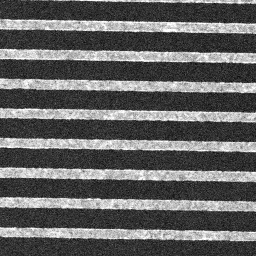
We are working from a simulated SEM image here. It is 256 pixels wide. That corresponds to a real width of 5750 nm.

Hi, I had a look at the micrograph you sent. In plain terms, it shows parallel lines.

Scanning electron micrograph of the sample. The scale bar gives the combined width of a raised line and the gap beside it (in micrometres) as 0.667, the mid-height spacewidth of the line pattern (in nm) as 472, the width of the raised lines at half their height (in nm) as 194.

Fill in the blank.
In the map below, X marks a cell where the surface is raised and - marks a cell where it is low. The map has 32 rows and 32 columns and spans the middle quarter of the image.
--------------------------------
--------------------------------
--------------------------------
--------------------------------
XXXXXXXXXXXXXXXXXX-X------------
XXXXXXXXXXXXXXXXXXXXXXXXXXXXXXXX
-----------X----XXXXXXXXXXXXXXXX
--------------------------------
--------------------------------
--------------------------------
--------------------------------
--------------------------------
XXXXXXXXXXXXXXXXXXXXXXXXXXXXXXXX
XXXXXXXXXXXXXXXXXXXXXXXXXXXXXXXX
--------------------------------
--------------------------------
--------------------------------
--------------------------------
--------------------------------
XXXXXXXXXXXXXXXXXXXXXXXXXXXXXX--
XXXXXXXXXXXXXXXXXXXXXXXXXXXXXXXX
--------------------------------
--------------------------------
--------------------------------
--------------------------------
--------------------------------
XXXXX---------------------------
XXXXXXXXXXXXXXXXXXXXXXXXXXXXXXXX
----XXXXXXXXXXXXXXXXXXXXXXXXXXXX
--------------------------------
--------------------------------
--------------------------------